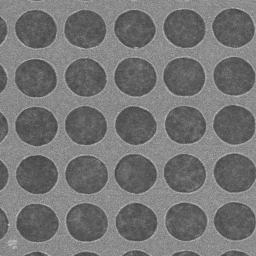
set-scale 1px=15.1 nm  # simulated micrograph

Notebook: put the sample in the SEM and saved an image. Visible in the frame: a regular array of holes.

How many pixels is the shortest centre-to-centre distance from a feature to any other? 48.2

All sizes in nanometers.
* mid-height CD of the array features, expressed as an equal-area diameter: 615